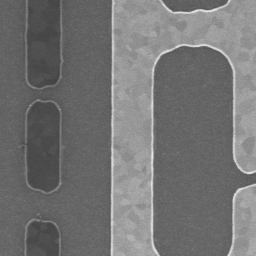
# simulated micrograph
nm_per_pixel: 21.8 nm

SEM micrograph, one or a few lines or trenches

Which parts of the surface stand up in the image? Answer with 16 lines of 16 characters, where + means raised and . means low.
..++...+++....++
..++...+++++++++
..++...+++++++++
..++...+++....++
..++...+++.....+
.......+++.....+
..+....++......+
..++...++......+
..++...++......+
..++...++......+
..++...++......+
..++...++.......
.......++......+
.......+++.....+
..++...+++.....+
..++...+++....++